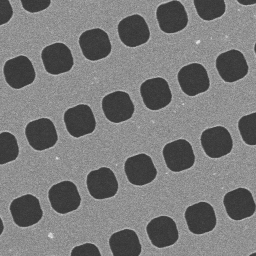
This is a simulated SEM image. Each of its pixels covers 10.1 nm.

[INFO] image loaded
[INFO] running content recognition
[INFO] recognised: a regular array of holes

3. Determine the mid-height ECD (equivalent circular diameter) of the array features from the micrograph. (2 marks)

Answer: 32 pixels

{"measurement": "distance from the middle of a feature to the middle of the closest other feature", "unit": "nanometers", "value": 409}